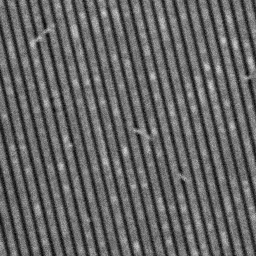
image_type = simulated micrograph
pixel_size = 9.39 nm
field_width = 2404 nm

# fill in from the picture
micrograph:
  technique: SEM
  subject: parallel lines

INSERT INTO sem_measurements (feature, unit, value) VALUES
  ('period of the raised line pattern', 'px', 11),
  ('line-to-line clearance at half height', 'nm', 49.2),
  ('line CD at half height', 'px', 6.08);